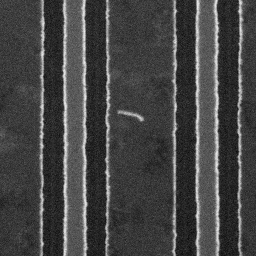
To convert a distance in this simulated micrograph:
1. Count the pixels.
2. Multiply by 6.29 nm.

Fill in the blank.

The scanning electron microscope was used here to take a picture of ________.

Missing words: lines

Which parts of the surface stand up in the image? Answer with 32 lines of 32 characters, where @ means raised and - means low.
@@@@@---@@@--@@@@@@@@@---@@---@@
@@@@@---@@---@@@@@@@@@---@@---@@
@@@@@---@@---@@@@@@@@@---@@---@@
@@@@@---@@---@@@@@@@@@---@@---@@
@@@@@---@@@--@@@@@@@@@---@@---@@
@@@@@---@@@--@@@@@@@@@---@@---@@
@@@@@---@@@--@@@@@@@@@---@@---@@
@@@@@---@@@--@@@@@@@@@---@@---@@
@@@@@---@@@--@@@@@@@@@---@@---@@
@@@@@---@@@--@@@@@@@@@---@@---@@
@@@@@---@@@--@@@@@@@@@---@@---@@
@@@@@---@@@--@@@@@@@@@---@@---@@
@@@@@---@@@---@@@@@@@@---@@---@@
@@@@@---@@@--@@@@@@@@@---@@---@@
@@@@@---@@@--@@@@@@@@@---@@---@@
@@@@@---@@@--@@@@@@@@@---@@---@@
@@@@@---@@@--@@@@@@@@@---@@---@@
@@@@@---@@@--@@@@@@@@@---@@---@@
@@@@@---@@---@@@@@@@@@---@@---@@
@@@@@---@@@--@@@@@@@@@---@@---@@
@@@@@---@@@--@@@@@@@@@---@@---@@
@@@@@---@@@--@@@@@@@@@---@@---@@
@@@@@---@@@--@@@@@@@@@---@@---@@
@@@@@---@@@--@@@@@@@@@---@@---@@
@@@@@---@@@--@@@@@@@@@---@@---@@
@@@@@---@@@--@@@@@@@@@---@@---@@
@@@@@---@@@--@@@@@@@@@---@@---@@
@@@@@---@@@--@@@@@@@@@---@@---@@
@@@@@---@@@--@@@@@@@@@---@@---@@
@@@@@---@@@--@@@@@@@@@---@@---@@
@@@@@---@@@--@@@@@@@@@---@@---@@
@@@@@---@@@--@@@@@@@@@---@@---@@